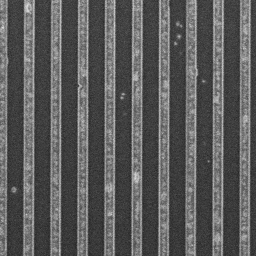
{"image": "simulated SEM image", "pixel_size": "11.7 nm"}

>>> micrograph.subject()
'parallel lines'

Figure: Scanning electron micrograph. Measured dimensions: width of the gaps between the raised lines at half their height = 209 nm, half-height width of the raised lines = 99.3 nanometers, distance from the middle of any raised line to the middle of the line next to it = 316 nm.